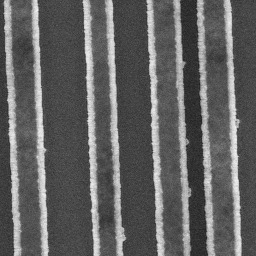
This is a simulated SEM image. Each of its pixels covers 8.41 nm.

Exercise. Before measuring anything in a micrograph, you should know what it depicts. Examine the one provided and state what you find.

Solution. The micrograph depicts lines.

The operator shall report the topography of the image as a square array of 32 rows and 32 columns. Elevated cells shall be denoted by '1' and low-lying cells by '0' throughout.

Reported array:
01110000000111000001110001111000
01110000000111000001110001111000
01111000000111000001110001111000
01111000000111000001110001111000
01111000000111000001110001111000
01111000000111000001110001111000
01111000000111000001111001111000
01111000000111000001111001111000
01111000000111000001111001111000
01111000000111000001111001111000
01111000000111000001111001111000
01111000000111000001111001111000
01111000000111000001111001111000
01111000000111000001111001111000
01111000000111000001111001111000
01111000000111000001111001111000
01111000000111000001111001111000
01111000000111100001111001111000
01111000000111100001111000111000
01111000000111100001111000111000
01111000000111100001111000111000
00111000000111100001111000111100
00111000000011100001111000111100
00111000000111100000111000111100
00111000000011100000111000111100
00111100000011100000111000111100
00111100000011100000111000111100
00111100000011100000111000111100
00111100000011100000111000111100
00111100000011100000111100111100
00111100000011100000111100111100
00111100000011100000111100111100